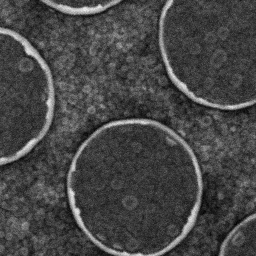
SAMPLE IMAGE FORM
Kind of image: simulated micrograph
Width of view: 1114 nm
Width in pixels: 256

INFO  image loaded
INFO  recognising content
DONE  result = raised bodies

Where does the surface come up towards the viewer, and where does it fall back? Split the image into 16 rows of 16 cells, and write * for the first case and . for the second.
....**....******
..........******
*.........******
**........******
***........*****
***........*****
***..........***
***.............
***...*****.....
**...*******....
....********....
....*********...
....********....
.....*******....
.....*******...*
......*****...**